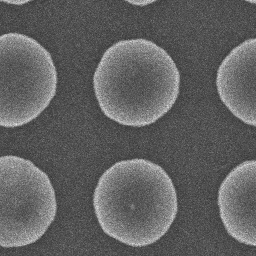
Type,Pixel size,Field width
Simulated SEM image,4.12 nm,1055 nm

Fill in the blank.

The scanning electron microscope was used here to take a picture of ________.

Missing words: raised bodies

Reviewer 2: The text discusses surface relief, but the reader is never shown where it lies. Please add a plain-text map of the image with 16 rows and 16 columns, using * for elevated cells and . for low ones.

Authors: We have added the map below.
................
................
**..............
***...*****...**
***...*****...**
***...*****...**
***...*****...**
**.....***.....*
................
................
**.....***.....*
***...*****...**
***...*****...**
***...*****...**
***....***....**
................